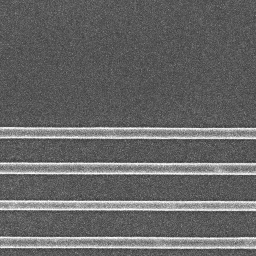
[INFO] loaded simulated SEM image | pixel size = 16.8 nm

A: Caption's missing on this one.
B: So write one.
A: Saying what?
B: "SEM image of parallel lines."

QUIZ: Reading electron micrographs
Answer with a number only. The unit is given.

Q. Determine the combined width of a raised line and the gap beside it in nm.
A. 612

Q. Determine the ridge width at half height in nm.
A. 170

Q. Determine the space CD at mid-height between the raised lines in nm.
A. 464